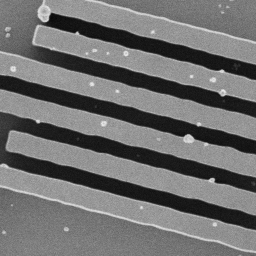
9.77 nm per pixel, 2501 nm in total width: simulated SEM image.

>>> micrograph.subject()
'groups of lines, slits or small figures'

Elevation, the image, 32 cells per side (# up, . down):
.....########...................
.....############...............
.....#....###########...........
.....##.......###########.......
....######.......############...
....###########.......##########
........##########........######
####.......###########........##
########.......###########......
.###########.......###########..
.....###########.......#########
##.......##########........#####
#####........##########........#
#########........##########.....
..###########.......###########.
......###########.......########
.#........##########........####
.#####........###########.......
.#########........###########...
...###########........##########
.......###########.......#######
###........###########.......###
########.......############.....
.###########.......###########..
.....##########.......##########
........###########........#####
............###########.......##
................###########.....
....................###########.
........................########
............................####
................................